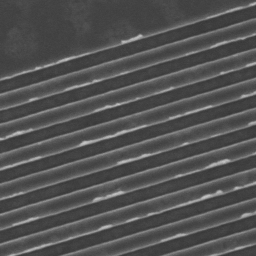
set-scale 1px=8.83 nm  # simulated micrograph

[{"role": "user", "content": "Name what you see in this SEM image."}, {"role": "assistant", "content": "parallel lines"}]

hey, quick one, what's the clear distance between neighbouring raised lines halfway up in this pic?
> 115 nm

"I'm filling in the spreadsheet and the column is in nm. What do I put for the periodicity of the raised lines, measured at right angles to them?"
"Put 253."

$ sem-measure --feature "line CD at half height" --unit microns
0.138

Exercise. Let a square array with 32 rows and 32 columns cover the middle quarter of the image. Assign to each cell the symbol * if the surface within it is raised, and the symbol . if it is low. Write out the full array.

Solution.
........**************..........
.....*************............**
.**************...........******
************...........*********
********............************
*****...........**************..
*............**************.....
..........*************.........
......**************...........*
...**************...........****
*************............*******
**********...........***********
******............*************.
***............*************....
...........**************.......
........*************...........
.....************.............**
.**************...........******
***********............*********
********............************
****............*************...
*............*************......
..........*************.........
......*************............*
...**************...........****
************.............*******
**********...........***********
******............*************.
**.............************.....
...........*************........
........*************...........
.....************.............**